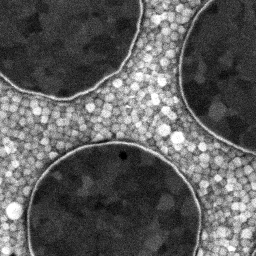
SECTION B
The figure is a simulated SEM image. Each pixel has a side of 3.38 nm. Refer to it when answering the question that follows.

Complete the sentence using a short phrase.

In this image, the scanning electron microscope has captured raised bodies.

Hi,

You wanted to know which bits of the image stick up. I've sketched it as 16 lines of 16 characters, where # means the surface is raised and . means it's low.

#########....###
#########...####
########....####
########...#####
#######....#####
.#####.....#####
............####
............####
.............###
.....#####......
...########.....
..##########....
..##########....
..###########...
..##########....
..##########....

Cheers